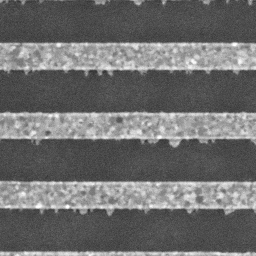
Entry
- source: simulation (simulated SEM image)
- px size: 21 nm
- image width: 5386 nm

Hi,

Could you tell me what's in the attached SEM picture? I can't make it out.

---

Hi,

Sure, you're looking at lines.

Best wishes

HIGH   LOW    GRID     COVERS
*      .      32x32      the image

................................
................................
................................
................................
................................
********************************
********************************
********************************
********************************
................................
................................
................................
................................
................................
********************************
********************************
********************************
................................
................................
................................
................................
................................
................................
********************************
********************************
********************************
................................
................................
................................
................................
................................
................................